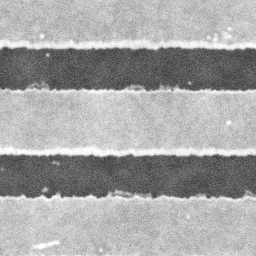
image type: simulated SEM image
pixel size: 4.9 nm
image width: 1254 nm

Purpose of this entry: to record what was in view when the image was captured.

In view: lines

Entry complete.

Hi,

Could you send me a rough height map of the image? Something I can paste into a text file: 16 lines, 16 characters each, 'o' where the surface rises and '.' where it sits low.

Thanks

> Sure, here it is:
oooooooooooooooo
oooooooooooooooo
oooooooooooooooo
................
................
................
oooooooooooooooo
oooooooooooooooo
oooooooooooooooo
oooooooooooooooo
................
................
oooooooooooooooo
oooooooooooooooo
oooooooooooooooo
oooooooooooooooo